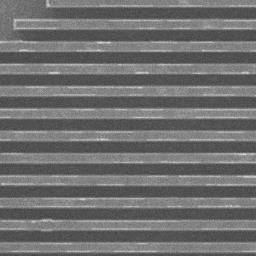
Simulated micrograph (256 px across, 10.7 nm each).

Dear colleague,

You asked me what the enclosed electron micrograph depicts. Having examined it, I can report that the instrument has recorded parallel lines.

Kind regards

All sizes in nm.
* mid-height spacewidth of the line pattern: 130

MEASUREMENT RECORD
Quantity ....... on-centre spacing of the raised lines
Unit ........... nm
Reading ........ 238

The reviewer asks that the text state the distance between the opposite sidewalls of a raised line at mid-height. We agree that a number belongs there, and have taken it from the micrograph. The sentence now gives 111 nm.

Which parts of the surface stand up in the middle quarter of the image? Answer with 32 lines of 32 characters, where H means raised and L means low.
HHHHHHHHHHHHHHHHHHHHHHHHHHHHHHHH
HHHHHHHHHHHHHHHHHHHHHHHHHHHHHHHH
LLLLLLLLLLLLLLLLLLLLLLLLLLLLLLLL
LLLLLLLLLLLLLLLLLLLLLLLLLLLLLLLL
LLLLLLLLLLLLLLLLLLLLLLLLLLLLLLLL
LLLLLLLLLLLLLLLLLLLLLLLLLLLLLLLL
HHHHHHHHHHHHHHHHHHHHHHHHHHHHHHHH
HHHHHHHHHHHHHHHHHHHHHHHHHHHHHHHH
LLLLLLLLLLLLLLLLLLLLLLLLLLLLLLLL
LLLLLLLLLLLLLLLLLLLLLLLLLLLLLLLL
LLLLLLLLLLLLLLLLLLLLLLLLLLLLLLLL
HHHHHHHHHHHHHHHHHHHHHHHHHHHHHHHH
HHHHHHHHHHHHHHHHHHHHHHHHHHHHHHHH
HHHHHHHHHHHHHHHHHHHHHHHHHHHHHHHH
LLLLLLLLLLLLLLLLLLLLLLLLLLLLLLLL
LLLLLLLLLLLLLLLLLLLLLLLLLLLLLLLL
LLLLLLLLLLLLLLLLLLLLLLLLLLLLLLLL
HHHHHHHHHHHHHHHHHHHHHHHHHHHHHHHH
HHHHHHHHHHHHHHHHHHHHHHHHHHHHHHHH
LLLLLLLLLLLLLLLLLLLLLLLLLLLLLLLL
LLLLLLLLLLLLLLLLLLLLLLLLLLLLLLLL
LLLLLLLLLLLLLLLLLLLLLLLLLLLLLLLL
HHHHHHHHHHHHHHHHHHHHHHHHHHHHHHHH
HHHHHHHHHHHHHHHHHHHHHHHHHHHHHHHH
HHHHHHHHHHHHHHHHHHHHHHHHHHHHHHHH
LLLLLLLLLLLLLLLLLLLLLLLLLLLLLLLL
LLLLLLLLLLLLLLLLLLLLLLLLLLLLLLLL
LLLLLLLLLLLLLLLLLLLLLLLLLLLLLLLL
HHHHHHHHHHHHHHHHHHHHHHHHHHHHHHHH
HHHHHHHHHHHHHHHHHHHHHHHHHHHHHHHH
LLLLLLLLLLLLLLLLLLLLLLLLLLLLLLLL
LLLLLLLLLLLLLLLLLLLLLLLLLLLLLLLL